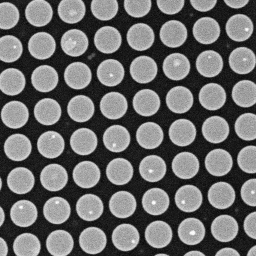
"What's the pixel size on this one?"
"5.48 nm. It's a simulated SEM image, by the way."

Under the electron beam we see an array of small figures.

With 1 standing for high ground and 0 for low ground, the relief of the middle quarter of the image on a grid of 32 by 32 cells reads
01111100011111000111111001111110
11111100111111100111111001111110
11111110111111100111111001111110
11111110111111100111111000111100
11111100011111000011100000000000
01111100000000000000000000000000
00000000000000000000010000011110
00000000000111000011111000111111
00111100001111100111111100111111
01111110011111110111111100111111
01111110011111110111111100111111
01111110011111110011111000011110
01111110001111100001110000000000
00111110000111000000000000000000
00000000000000000000000000011111
00000000000011000001111100011111
00011100000111110011111100111111
00111111001111110011111110111111
00111111001111110011111110011111
00111111001111110001111100011111
00111111001111110001111000000000
00111110000111100000000000000000
00001100000000000000000000000111
00000000000000000000111100001111
00000110000011110001111110011111
00011111000111111001111110011111
00111111100111111001111110011111
10111111100111111001111110001111
10111111100111111000111100000111
10011111000011110000000000000000
00001110000000000000000000000011
00000000000000000000011110000111